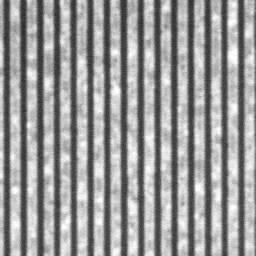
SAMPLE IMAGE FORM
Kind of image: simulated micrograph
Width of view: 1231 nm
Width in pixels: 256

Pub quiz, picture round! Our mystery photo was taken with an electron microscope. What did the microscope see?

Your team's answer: parallel lines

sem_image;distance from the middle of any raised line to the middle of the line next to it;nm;80.5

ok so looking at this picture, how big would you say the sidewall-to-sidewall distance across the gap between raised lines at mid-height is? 40.3 nm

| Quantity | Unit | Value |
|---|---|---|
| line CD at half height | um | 0.0403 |